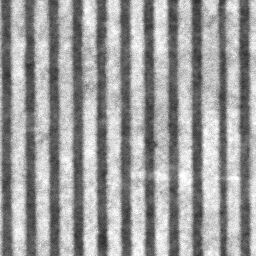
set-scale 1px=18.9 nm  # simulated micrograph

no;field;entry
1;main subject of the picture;parallel lines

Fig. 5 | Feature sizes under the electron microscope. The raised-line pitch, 0.451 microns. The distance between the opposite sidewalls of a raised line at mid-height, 196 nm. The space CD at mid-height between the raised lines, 253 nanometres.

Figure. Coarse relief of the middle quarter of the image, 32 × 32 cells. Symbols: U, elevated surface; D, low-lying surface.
DDUUUDDDUUUDDDUUUDDDUUUDDDUUDDDD
DDUUUDDDUUUDDDUUUDDDUUUDDDUUDDDD
DDUUUDDDUUUDDDUUUDDDUUUDDDUUDDDD
DDUUUDDDUUUDDDUUUDDDUUUDDDUUDDDD
DDUUUDDDUUUDDDUUUDDDUUUDDDUUDDDD
DDUUUDDDUUUDDDUUDDDDUUUDDDUUDDDD
DDUUUDDDUUUDDDUUDDDDUUUDDDUUUDDD
DDUUUDDDUUUDDDUUDDDDUUUDDDUUDDDD
DDUUUDDDUUUDDDUUDDDDUUUDDDUUDDDD
DDUUUDDDUUUDDDUUUDDDUUUDDDUUDDDD
DDUUUDDDUUUDDDUUUDDDUUUDDDUUDDDD
DDUUUDDDUUUDDDUUUDDDUUUDDDUUDDDD
DDUUUDDDUUUDDDUUUDDDUUUDDDUUDDDD
DDUUUDDDUUUDDDUUUDDDUUUDDDUUUDDD
DDUUUDDDUUUDDDUUUDDDUUUDDDUUUDDD
DDUUUDDDUUUDDDUUUDDDUUDDDDUUDDDD
DDUUUDDDUUUDDDUUUDDDUUDDDDUUDDDD
DDUUUDDDUUUDDDUUUDDDUUUDDDUUUDDD
DDUUUDDDUUUDDDUUUDDDUUUDDDUUUDDD
DDUUUDDDUUDDDDUUUDDDUUUDDDUUUDDD
DDUUUDDDUUUDDDUUUDDDUUUDDDUUUDDD
DDUUUDDDUUUDDDUUUDDDUUUDDDUUUDDD
DDUUUDDDUUUDDDUUUDDDUUUDDDUUUDDD
DDUUUDDDUUUDDDUUUDDDUUUDDDUUUDDD
DDUUUDDDUUUDDDUUUDDDUUUDDDUUUDDD
DDUUUDDDUUUDDDUUUDDDUUUDDDUUUDDD
DDUUUDDDUUUDDDUUUDDDUUUDDDUUUDDD
DDUUUDDDUUUDDDUUUDDDUUUDDDUUUDDD
DDUUUDDDUUUDDDUUUDDDUUUDDDUUUDDD
DDUUUDDDUUUDDDUUUDDDUUUDDDUUUDDD
DDUUUDDDUUUDDDUUUDDDUUUDDDUUUDDD
DDDUUDDDUUUDDDUUUDDDUUUDDDUUUDDD